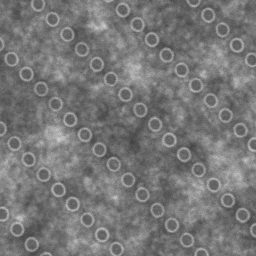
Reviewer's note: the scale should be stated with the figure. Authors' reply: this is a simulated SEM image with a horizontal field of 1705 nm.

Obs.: a regular array of raised bodies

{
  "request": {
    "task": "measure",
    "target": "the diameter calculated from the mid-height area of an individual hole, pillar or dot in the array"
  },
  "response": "0.086 micrometres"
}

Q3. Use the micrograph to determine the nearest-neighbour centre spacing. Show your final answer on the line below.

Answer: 139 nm